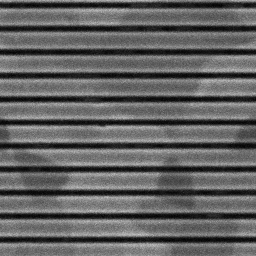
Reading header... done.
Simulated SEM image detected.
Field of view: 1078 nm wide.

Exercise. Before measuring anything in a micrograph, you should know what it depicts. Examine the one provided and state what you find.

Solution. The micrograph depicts parallel lines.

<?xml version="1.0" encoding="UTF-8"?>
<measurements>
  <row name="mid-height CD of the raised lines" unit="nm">65.3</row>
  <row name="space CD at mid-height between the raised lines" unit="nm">32.6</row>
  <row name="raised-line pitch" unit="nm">98.8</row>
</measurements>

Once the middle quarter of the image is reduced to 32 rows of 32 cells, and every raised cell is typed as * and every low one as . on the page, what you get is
********************************
********************************
................................
................................
********************************
********************************
********************************
********************************
................................
................................
********************************
********************************
********************************
................................
................................
................................
********************************
********************************
********************************
................................
................................
********************************
********************************
********************************
********************************
................................
................................
********************************
********************************
********************************
********************************
................................